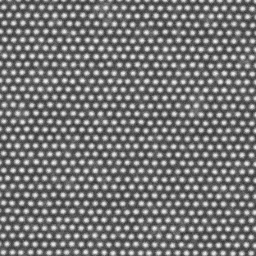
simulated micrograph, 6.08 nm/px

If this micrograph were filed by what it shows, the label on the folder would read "a regular array of raised bodies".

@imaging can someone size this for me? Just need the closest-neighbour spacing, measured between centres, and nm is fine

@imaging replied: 53.3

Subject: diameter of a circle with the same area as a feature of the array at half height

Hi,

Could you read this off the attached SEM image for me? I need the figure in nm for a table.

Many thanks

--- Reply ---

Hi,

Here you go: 26.6